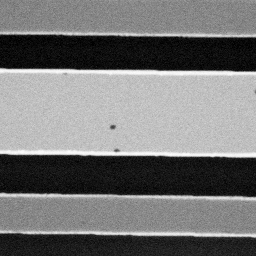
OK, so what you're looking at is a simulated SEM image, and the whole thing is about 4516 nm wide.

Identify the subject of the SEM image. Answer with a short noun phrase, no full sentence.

lines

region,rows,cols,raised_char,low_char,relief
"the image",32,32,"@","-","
@@@@@@@@@@@@@@@@@@@@@@@@@@@@@@@@
@@@@@@@@@@@@@@@@@@@@@@@@@@@@@@@@
@@@@@@@@@@@@@@@@@@@@@@@@@@@@@@@@
@@@@@@@@@@@@@@@@@@@@@@@@@@@@@@@@
--------------------------------
--------------------------------
--------------------------------
--------------------------------
--------------------------------
@@@@@@@@@@@@@@@@@@@@@@@@@@@@@@@@
@@@@@@@@@@@@@@@@@@@@@@@@@@@@@@@@
@@@@@@@@@@@@@@@@@@@@@@@@@@@@@@@@
@@@@@@@@@@@@@@@@@@@@@@@@@@@@@@@@
@@@@@@@@@@@@@@@@@@@@@@@@@@@@@@@@
@@@@@@@@@@@@@@@@@@@@@@@@@@@@@@@@
@@@@@@@@@@@@@@@@@@@@@@@@@@@@@@@@
@@@@@@@@@@@@@@@@@@@@@@@@@@@@@@@@
@@@@@@@@@@@@@@@@@@@@@@@@@@@@@@@@
@@@@@@@@@@@@@@@@@@@@@@@@@@@@@@@@
-----------------------------@@@
--------------------------------
--------------------------------
--------------------------------
--------------------------------
@@@@@@@@------------------------
@@@@@@@@@@@@@@@@@@@@@@@@@@@@@@@@
@@@@@@@@@@@@@@@@@@@@@@@@@@@@@@@@
@@@@@@@@@@@@@@@@@@@@@@@@@@@@@@@@
@@@@@@@@@@@@@@@@@@@@@@@@@@@@@@@@
--------------------------------
--------------------------------
--------------------------------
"